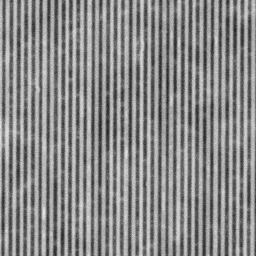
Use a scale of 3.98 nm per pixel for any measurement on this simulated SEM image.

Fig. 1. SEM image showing parallel lines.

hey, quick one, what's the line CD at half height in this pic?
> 12.9 nm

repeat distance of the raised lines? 29.7 nm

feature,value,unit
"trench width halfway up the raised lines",15.9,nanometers